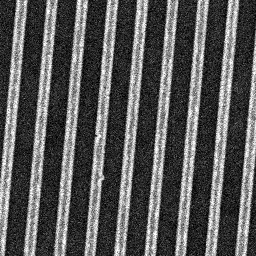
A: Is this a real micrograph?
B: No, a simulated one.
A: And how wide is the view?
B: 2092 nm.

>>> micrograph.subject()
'parallel lines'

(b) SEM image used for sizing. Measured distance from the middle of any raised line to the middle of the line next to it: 246 nanometers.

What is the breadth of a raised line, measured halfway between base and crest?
68.1 nanometers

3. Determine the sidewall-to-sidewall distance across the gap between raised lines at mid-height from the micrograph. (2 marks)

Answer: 177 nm